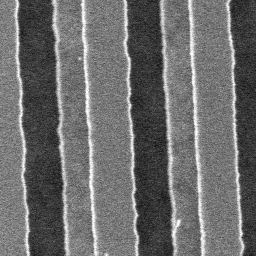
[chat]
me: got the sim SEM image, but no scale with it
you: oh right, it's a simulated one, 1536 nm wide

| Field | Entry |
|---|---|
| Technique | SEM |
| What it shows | lines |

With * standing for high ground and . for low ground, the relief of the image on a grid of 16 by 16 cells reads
*..*****..****..
*..*****..****..
*...****..****..
*...****..*****.
*...****..*****.
*...****..*****.
*...****..*****.
*...****..*****.
*...****...****.
**..****...****.
*...****...****.
**..****...****.
**..****...****.
**..*****..****.
**..*****..****.
**..*****..****.